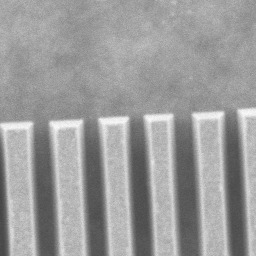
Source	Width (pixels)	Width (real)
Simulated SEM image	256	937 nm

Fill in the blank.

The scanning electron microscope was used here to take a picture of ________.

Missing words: parallel lines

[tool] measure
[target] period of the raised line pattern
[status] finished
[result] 0.174 microns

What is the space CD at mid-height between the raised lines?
72.7 nm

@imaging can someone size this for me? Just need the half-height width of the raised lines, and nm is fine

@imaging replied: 101